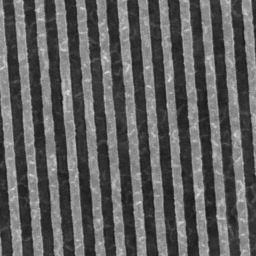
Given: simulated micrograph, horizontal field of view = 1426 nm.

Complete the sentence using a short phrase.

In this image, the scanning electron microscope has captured parallel lines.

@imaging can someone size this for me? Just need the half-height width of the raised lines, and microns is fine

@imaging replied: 0.0479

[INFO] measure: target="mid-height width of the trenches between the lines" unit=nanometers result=65.2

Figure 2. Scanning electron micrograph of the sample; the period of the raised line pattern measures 0.115 um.